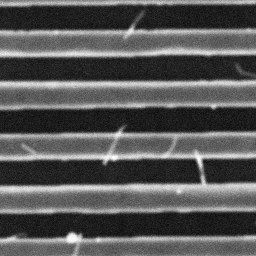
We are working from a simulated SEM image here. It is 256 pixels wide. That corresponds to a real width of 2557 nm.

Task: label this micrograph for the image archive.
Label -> lines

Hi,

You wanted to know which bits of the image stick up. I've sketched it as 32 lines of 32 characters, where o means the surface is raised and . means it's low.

ooooooooooooooo..ooooo..........
................................
................................
................................
oooooooooooooooooooooooooooooooo
oooooooooooooooooooooooooooooooo
oooooooooooooooooooooooooooooooo
................................
................................
................................
oooooooooooooooooooooooooooooooo
oooooooooooooooooooooooooooooooo
oooooooooooooooooooooooooooooooo
ooo.............................
................................
................................
................................
oooooooooooooooooooooooooooooooo
oooooooooooooooooooooooooooooooo
oooooooooooooooooooooooooooooooo
................................
................................
................................
oooooooooooooooooooooooooooooooo
oooooooooooooooooooooooooooooooo
oooooooooooooooooooooooooooooooo
ooooooo...ooooo.................
................................
................................
.........o......................
oooooooooooooooooooooooooooooooo
oooooooooooooooooooooooooooooooo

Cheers